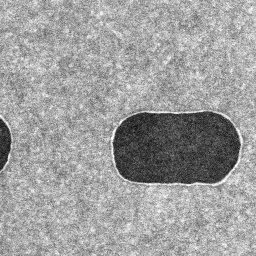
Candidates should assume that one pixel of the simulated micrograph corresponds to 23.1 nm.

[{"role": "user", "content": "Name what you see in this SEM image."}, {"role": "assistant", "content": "holes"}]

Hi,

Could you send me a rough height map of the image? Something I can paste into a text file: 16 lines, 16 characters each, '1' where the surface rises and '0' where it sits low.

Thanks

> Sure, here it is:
1111111111111111
1111111111111111
1111111111111111
1111111111111111
1111111111111111
1111111111111111
1111111111111111
1111111100000011
0111111000000001
0111111000000001
1111111000000001
1111111111000111
1111111111111111
1111111111111111
1111111111111111
1111111111111111